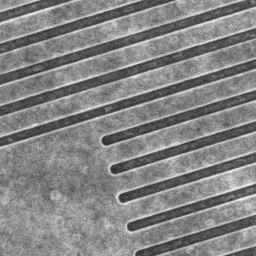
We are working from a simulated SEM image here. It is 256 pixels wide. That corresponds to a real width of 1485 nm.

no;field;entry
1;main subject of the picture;parallel lines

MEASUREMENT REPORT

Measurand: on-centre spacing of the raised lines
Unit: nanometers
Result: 173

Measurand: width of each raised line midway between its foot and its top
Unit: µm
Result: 0.115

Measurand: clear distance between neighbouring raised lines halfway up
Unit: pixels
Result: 10.3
